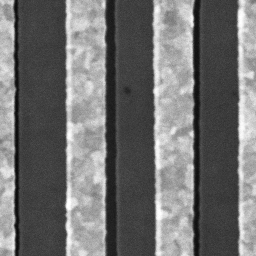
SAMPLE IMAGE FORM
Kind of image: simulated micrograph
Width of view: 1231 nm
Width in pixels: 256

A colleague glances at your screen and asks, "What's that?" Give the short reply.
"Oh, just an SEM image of lines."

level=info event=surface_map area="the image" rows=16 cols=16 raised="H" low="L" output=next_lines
HLLLHHHLLLHHLLLH
HLLLHHHLLLHHLLLH
HLLLHHHLLLHHLLLH
HLLLHHHLLLHHLLLH
HLLLHHHLLLHHLLLH
HLLLHHHLLLHHLLLH
HLLLHHHLLLHHLLLH
HLLLHHHLLLHHLLLH
HLLLHHHLLLHHLLLH
HLLLHHHLLLHHLLLH
HLLLHHHLLLHHLLLH
HLLLHHHLLLHHLLLH
HLLLHHHLLLHHLLLH
HLLLHHHLLLHHLLLH
HLLLHHHLLLHHLLLH
HLLLHHHLLLHHLLLH